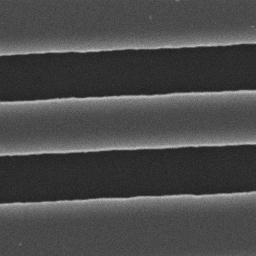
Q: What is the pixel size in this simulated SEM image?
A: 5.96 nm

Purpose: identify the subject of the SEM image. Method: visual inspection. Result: lines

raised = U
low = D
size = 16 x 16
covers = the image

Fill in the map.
UUUUUUUUUUUUUUUU
UUUUUUUUUUUUUUUU
UUUUUUUUUUUUUUUU
DDDDDDDDDDDDDDDD
DDDDDDDDDDDDDDDD
DDDDDDDDDDDDDDDD
UUUUUUUUUUUUUUUU
UUUUUUUUUUUUUUUU
UUUUUUUUUUUUUUUU
UUUUUUDDDDDDDDDD
DDDDDDDDDDDDDDDD
DDDDDDDDDDDDDDDD
DDDDDUUUUUUUUUUU
UUUUUUUUUUUUUUUU
UUUUUUUUUUUUUUUU
UUUUUUUUUUUUUUUU